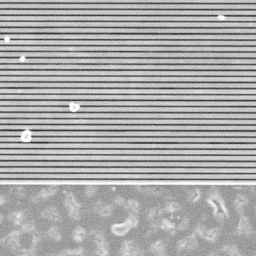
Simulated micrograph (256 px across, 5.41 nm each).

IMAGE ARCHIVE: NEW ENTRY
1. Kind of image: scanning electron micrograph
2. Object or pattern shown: parallel lines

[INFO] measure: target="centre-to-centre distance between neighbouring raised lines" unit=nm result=32.7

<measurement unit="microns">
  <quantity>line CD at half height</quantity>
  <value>0.023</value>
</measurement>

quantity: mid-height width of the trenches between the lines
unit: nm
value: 8.8